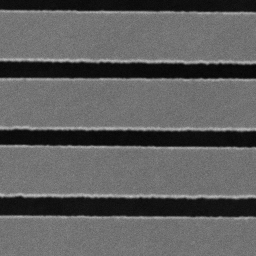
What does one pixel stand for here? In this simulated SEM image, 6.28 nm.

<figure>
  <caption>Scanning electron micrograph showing lines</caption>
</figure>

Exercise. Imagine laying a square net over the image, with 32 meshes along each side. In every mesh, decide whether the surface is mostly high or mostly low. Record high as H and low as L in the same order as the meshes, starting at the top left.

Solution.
LLLLLLLLLLLLLLLLLLLLLLLLLLLLLLLL
HHHHHHHHHHHHHHHHHHHHHHHHHLLLLLLL
HHHHHHHHHHHHHHHHHHHHHHHHHHHHHHHH
HHHHHHHHHHHHHHHHHHHHHHHHHHHHHHHH
HHHHHHHHHHHHHHHHHHHHHHHHHHHHHHHH
HHHHHHHHHHHHHHHHHHHHHHHHHHHHHHHH
HHHHHHHHHHHHHHHHHHHHHHHHHHHHHHHH
HHHHHHHHHHHHHHHHHHHHHHHHHHHHHHHH
LLLLLLLLLLLLLLLLLLLLLLLLLLLLLLLL
LLLLLLLLLLLLLLLLLLLLLLLLLLLLLLLL
HHHHHHHHHHHHHHHHHHHHHHHHHHHHHHHH
HHHHHHHHHHHHHHHHHHHHHHHHHHHHHHHH
HHHHHHHHHHHHHHHHHHHHHHHHHHHHHHHH
HHHHHHHHHHHHHHHHHHHHHHHHHHHHHHHH
HHHHHHHHHHHHHHHHHHHHHHHHHHHHHHHH
HHHHHHHHHHHHHHHHHHHHHHHHHHHHHHHH
LLLLLLLLLLLLLLLLLLLLLLLLLLLLLLLL
LLLLLLLLLLLLLLLLLLLLLLLLLLLLLLLL
HHHHHHHHHHHHHHHHHHHHHHHHHHHHHHHH
HHHHHHHHHHHHHHHHHHHHHHHHHHHHHHHH
HHHHHHHHHHHHHHHHHHHHHHHHHHHHHHHH
HHHHHHHHHHHHHHHHHHHHHHHHHHHHHHHH
HHHHHHHHHHHHHHHHHHHHHHHHHHHHHHHH
HHHHHHHHHHHHHHHHHHHHHHHHHHHHHHHH
HHHHHHHHHHHHHHHHHHHHHHHHHHHHHHHH
LLLLLLLLLLLLLLLLLLLLLLLLLLLLLLLL
LLLLLLLLLLLLLLLLLLLLLLLLLLLLLLLL
HHHHHHHHHHHHHHHHHHHHHHHHHHHHHHHH
HHHHHHHHHHHHHHHHHHHHHHHHHHHHHHHH
HHHHHHHHHHHHHHHHHHHHHHHHHHHHHHHH
HHHHHHHHHHHHHHHHHHHHHHHHHHHHHHHH
HHHHHHHHHHHHHHHHHHHHHHHHHHHHHHHH